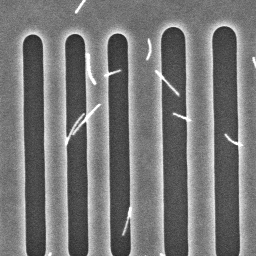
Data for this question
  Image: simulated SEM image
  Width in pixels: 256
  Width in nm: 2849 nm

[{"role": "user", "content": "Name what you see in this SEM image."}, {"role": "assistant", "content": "groups of lines, slits or small figures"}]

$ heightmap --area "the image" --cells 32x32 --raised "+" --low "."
++++++++++++++++++++++++++++++++
++++++++++++++++++++++++++++++++
++++++++++++++++++++++++++++++++
+++++++++++++++++++++.+++++..+++
+++..++++.++++..++++...++++...++
+++..+++...++...++++...+++....++
+++...++...++...++++...++++...++
+++...++...++...++++...++++...++
+++...++...++...++++...++++...++
+++...++...+++..++++...++++...++
+++...++...++...++++...++++...++
+++...++...++...++++...++++...++
+++...++...++...++++...++++...++
+++...++...++...++++...++++...++
+++...++...++...++++...++++...++
+++...++...++...++++...++++...++
+++...++...+++..++++...++++...++
+++...++...+++..++++...++++...++
+++...++...+++..++++...++++...++
+++...++...+++..++++...++++...++
+++...++...+++..++++...++++...++
+++...++...+++..++++....+++...++
+++...++...+++..++++....+++...++
+++...++...+++..++++....+++...++
+++...++...+++..++++....+++...++
+++...++...+++..++++....+++...++
+++...++...+++..++++....+++...++
+++...++...+++..++++....+++...++
+++...++...+++..++++....+++...++
+++...++...+++..++++....+++...++
+++...++...+++..++++....+++...++
+++...+++..+++..+++++...+++...++